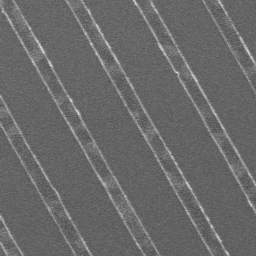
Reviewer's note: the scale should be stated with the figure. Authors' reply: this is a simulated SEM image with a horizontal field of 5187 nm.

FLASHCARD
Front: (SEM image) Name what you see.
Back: parallel lines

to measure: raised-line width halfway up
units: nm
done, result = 284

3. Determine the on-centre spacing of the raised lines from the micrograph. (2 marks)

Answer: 1200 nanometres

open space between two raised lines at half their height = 0.921 microns